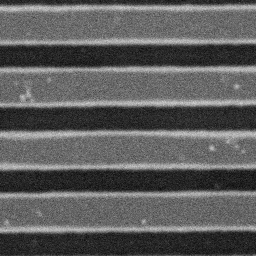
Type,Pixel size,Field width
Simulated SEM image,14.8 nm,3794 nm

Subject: lines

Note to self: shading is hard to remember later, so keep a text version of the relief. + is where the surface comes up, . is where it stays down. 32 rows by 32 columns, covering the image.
................................
++++++++++++++++++++++++++++++++
++++++++++++++++++++++++++++++++
++++++++++++++++++++++++++++++++
++++++++++++++++++++++++++++++++
................................
................................
................................
................................
++++++++++++++++++++++++++++++++
++++++++++++++++++++++++++++++++
++++++++++++++++++++++++++++++++
++++++++++++++++++++++++++++++++
................................
................................
................................
................................
++++++++++++++++++++++++++++++++
++++++++++++++++++++++++++++++++
++++++++++++++++++++++++++++++++
++++++++++++++++++++++++++++++++
................................
................................
................................
++++++++++++++++++++++++++++++++
++++++++++++++++++++++++++++++++
++++++++++++++++++++++++++++++++
++++++++++++++++++++++++++++++++
++++++++++++++++++++++++++++++++
................................
................................
................................